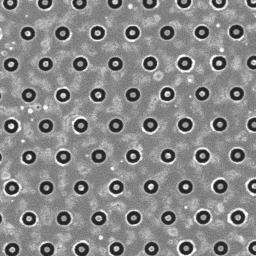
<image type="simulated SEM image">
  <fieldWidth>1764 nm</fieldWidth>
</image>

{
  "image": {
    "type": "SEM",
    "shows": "a regular array of ring-shaped grooves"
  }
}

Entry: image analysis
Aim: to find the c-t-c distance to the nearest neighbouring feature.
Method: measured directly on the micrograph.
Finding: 238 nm